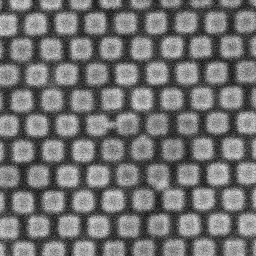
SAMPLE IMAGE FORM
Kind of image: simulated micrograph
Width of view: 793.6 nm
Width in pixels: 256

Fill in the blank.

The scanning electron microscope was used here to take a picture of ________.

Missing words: a regular array of raised bodies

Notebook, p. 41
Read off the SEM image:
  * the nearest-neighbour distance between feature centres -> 89.4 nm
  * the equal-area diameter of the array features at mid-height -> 61.2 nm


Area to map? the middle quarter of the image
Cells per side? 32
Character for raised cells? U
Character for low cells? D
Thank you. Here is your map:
DDDDDDDDUUDDDDUUUDDDDUUUUDDDDUUU
UUUDDDUUUUDDDUUUUUDDDUUUUDDDDUUU
UUUDDDUUUUDDDUUUUUDDDUUUUDDDDUUU
UUUDDDUUUUDDDDUUUUDDDUUUUDDDDUUU
UUDDDDUUDDDDDDUUUDDDDUUUDDDDDDDD
DDDDDDDDDDDDDDDDDDDDDDDDDDDDDDDD
DDDDDDDDDDDDDDDDDDDDDDDDDDDDDDDD
DDDUUUUDDDUUUUDDDUUUUUDDDUUUUDDD
DDUUUUUDDDUUUUDDDUUUUUDDDUUUUDDD
DDUUUUUDDDUUUUDDDUUUUUDDDUUUUDDD
DDUUUUUDDDUUUUDDDDUUUUDDDUUUUDDD
DDDDDDDDDDDDDDDDDDDDDDDDDDDDDDDD
DDDDDDDDDDDDDDDDDDDDDDDDDDDDDDDD
UUUDDDUUUUDDDDUUUUDDDUUUUUDDDUUU
UUUDDDUUUUUDDUUUUUDDDUUUUUDDDUUU
UUUDDDUUUUUUUUUUUUDDDUUUUDDDDUUU
UUUDDDUUUUDDDDUUUUDDDUUUUDDDDUUU
DDDDDDDDDDDDDDDUDDDDDDDDDDDDDDDD
DDDDDDDDDDDDDDDDDDDDDDDDDDDDDDDD
DDDDDDDDDDUUUUDDDDUUUDDDDUUUUDDD
DDDUUUUDDDUUUUDDDUUUUUDDDUUUUDDD
DDDUUUUDDDUUUUDDDUUUUUDDDUUUUDDD
DDDUUUUDDDUUUUDDDUUUUUDDDUUUUDDD
DDDUUUUDDDUUUUDDDDUUUDDDDDUDDDDD
DDDDDDDDDDDDDDDDDDDDDDDDDDDDDDDD
DDDDDDDDDDDDDDDDDDDDDDDUUDDDDDDD
UUUDDDDUUUUDDDUUUUDDDDUUUUDDDUUU
UUUDDDUUUUUDDDUUUUDDDDUUUUDDDUUU
UUUDDDUUUUUDDDUUUUDDDDUUUUDDDUUU
UUUDDDUUUUUDDDUUUUDDDDUUUUDDDUUU
DDDDDDDDDDDDDDDDDDDDDDDDDDDDDDDD
DDDDDDDDDDDDDDDDDDDDDDDDDDDDDDDD